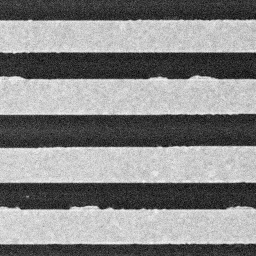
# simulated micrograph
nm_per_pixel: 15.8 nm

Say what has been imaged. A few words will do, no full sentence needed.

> lines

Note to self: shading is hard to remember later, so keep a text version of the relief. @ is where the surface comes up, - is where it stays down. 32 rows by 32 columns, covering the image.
--------------------------------
--------------------------------
--------------------------------
@@@@@@@@@@@@@@@@@@@@@@@@@@@@@@@@
@@@@@@@@@@@@@@@@@@@@@@@@@@@@@@@@
@@@@@@@@@@@@@@@@@@@@@@@@@@@@@@@@
@@@@---@------------------------
--------------------------------
--------------------------------
--------------------------------
@@@@@@@@@@@@@@@@@@@@@@@@@@@@@@@@
@@@@@@@@@@@@@@@@@@@@@@@@@@@@@@@@
@@@@@@@@@@@@@@@@@@@@@@@@@@@@@@@@
@@@@@@@@@@@@@@@@@@@@@@@@@@@@@@@@
--------------------------------
--------------------------------
--------------------------------
--------------------------------
-----@@@@@@@@@@@@@@@@@@@@@@@@@@@
@@@@@@@@@@@@@@@@@@@@@@@@@@@@@@@@
@@@@@@@@@@@@@@@@@@@@@@@@@@@@@@@@
@@@@@@@@@@@@@@@@@@@@@@@@@@@@@@@@
@@@@@@@@@@@@@@@@@@@@@@@@@@@@@@@@
--------------------------------
--------------------------------
--------------------------------
@@@@@@@@@@@@@@@@@@@@@@@@@@@@@@@@
@@@@@@@@@@@@@@@@@@@@@@@@@@@@@@@@
@@@@@@@@@@@@@@@@@@@@@@@@@@@@@@@@
@@@@@@@@@@@@@@@@@@@@@@@@@@@@@@@@
--------------------------------
--------------------------------